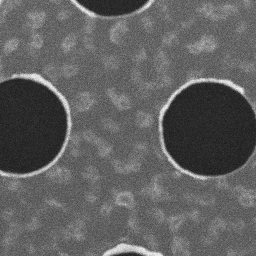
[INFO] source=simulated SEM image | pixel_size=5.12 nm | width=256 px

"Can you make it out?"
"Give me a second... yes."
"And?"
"holes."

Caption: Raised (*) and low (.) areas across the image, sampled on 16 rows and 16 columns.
*****....*******
****************
****************
****************
****************
...*********..**
....*******.....
....******......
....******......
....*******.....
...********....*
****************
****************
****************
****************
****************